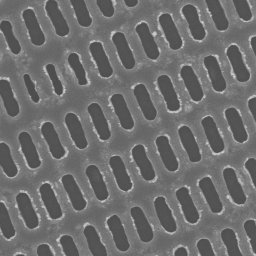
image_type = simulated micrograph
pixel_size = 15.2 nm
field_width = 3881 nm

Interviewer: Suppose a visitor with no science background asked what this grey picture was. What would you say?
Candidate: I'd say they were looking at a regular array of holes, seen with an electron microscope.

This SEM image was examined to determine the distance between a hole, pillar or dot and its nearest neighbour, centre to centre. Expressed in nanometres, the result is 379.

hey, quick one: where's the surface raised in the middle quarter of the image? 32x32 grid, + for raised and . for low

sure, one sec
+....+++....+++...++++++++++++.+
++...+++....+++++++++++++++++...
+++..++++...+++++++++++++++++...
+++..++++++++++++++++++...+++...
++++..+++++++++++++++++....+++..
++++++++++++++++++..+++....+++..
+++++++++++++++++....+++....+++.
+++++++++++++.+++....++++...+++.
++++++++++++...+++....+++...++++
++++++++++++...+++....+++....+++
++++++...+++....+++....+++...+++
++++++....+++...+++....+++..++++
+..+++....+++....+++...+++++++++
...++++...++++...+++...+++++++++
....+++....+++...+++++++++++++++
+...++++...+++...+++++++++++++++
+....+++...++++++++++++++++++...
+....+++....+++++++++++++++++...
++....+++..++++++++++++...+++...
++....+++++++++++++++++...+++...
+++...++++++++++++..+++....+++..
+++++++++++++++++...+++....+++..
+++++++++++++++++...++++....+++.
++++++++++++..+++....+++....+++.
+++++++++++....+++....+++...++++
++++++..+++....+++....+++....+++
+++++....+++...++++....+++..++++
++++++...+++....+++....+++++++++
..++++....+++....+++...+++++++++
...+++....+++....+++++++++++++++
...++++....++....+++++++++++++++
....+++....+++..++++++++++++...+